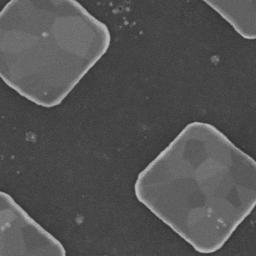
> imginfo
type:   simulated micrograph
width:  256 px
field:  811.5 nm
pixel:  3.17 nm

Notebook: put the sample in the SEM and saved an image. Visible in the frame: raised bodies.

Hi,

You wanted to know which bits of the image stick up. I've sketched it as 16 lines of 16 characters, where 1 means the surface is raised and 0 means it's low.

1111100000000111
1111110000000011
1111111000000000
1111110000000000
1111100000000000
0111000000000000
0000000000000000
0000000000000000
0000000000011100
0000000000111110
0000000001111111
0000000001111111
1000000001111111
1100000000111110
1110000000011100
1111000000001100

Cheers